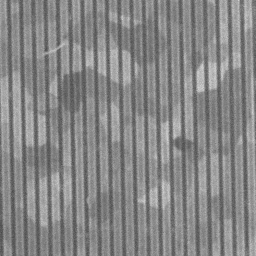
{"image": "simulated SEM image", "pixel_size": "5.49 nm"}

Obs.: parallel lines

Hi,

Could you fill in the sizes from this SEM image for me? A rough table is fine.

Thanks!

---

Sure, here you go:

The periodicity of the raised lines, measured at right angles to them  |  67.4 nm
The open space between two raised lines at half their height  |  30.9 nm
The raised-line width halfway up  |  35.7 nanometres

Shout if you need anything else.